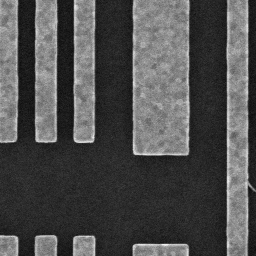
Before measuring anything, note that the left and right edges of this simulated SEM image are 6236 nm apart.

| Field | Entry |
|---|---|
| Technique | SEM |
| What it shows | wiring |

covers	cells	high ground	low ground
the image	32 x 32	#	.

##...##..###.....#######.....##.
##...##..###.....#######.....##.
##..###..###.....#######.....##.
##..###..###.....#######.....##.
##...##..###.....#######.....##.
##..###..###.....#######....###.
##..###..###.....#######....###.
##..###..###.....#######....###.
##..###..###.....#######.....##.
##...##..###.....######......##.
##..###..###.....#######.....##.
##..###..###.....#######.....##.
##..###..###.....#######.....##.
##..###..###.....#######.....##.
##..###..###.....#######.....##.
##..###..###.....#######.....##.
##...##..###.....#######.....##.
##...##..###.....#######.....##.
.................#######.....##.
.............................##.
.............................##.
.............................##.
.............................##.
............................###.
.............................##.
.............................##.
.............................##.
.............................##.
............................###.
............................###.
##..###..###.................##.
##..###..###.....######......##.